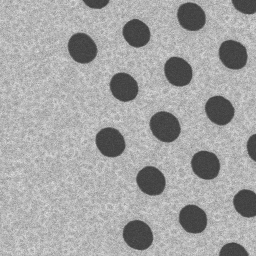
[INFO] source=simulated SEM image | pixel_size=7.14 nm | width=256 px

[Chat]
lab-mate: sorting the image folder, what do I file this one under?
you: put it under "a regular array of holes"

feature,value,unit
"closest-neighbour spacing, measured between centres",0.398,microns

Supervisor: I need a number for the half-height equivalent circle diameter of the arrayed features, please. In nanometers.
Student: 205